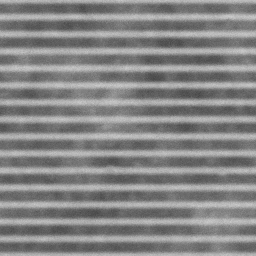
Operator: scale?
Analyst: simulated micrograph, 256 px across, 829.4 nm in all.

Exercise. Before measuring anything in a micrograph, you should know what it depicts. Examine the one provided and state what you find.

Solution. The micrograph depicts parallel lines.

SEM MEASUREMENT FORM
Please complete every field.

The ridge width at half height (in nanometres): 17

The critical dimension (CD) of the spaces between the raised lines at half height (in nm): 40.1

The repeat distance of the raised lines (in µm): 0.0551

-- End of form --